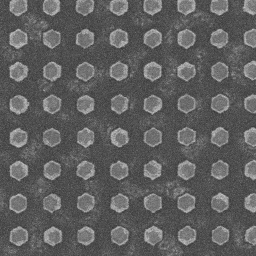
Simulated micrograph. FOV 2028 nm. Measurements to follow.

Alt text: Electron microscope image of a regular array of raised bodies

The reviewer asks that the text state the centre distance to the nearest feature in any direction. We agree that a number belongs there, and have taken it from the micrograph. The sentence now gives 259 nanometres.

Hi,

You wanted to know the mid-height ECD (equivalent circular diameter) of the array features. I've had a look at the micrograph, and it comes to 137 nanometers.